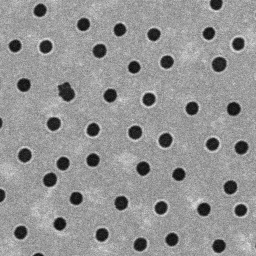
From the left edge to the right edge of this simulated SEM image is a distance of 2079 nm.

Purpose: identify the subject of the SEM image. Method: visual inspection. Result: a regular array of holes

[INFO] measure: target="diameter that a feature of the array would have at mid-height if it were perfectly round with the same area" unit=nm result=120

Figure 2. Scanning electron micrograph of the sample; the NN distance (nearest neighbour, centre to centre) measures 31.2 pixels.